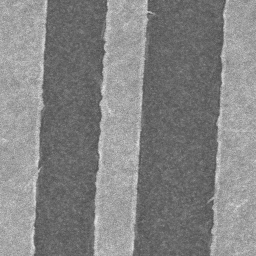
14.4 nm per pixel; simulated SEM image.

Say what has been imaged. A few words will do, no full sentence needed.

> one or a few lines or trenches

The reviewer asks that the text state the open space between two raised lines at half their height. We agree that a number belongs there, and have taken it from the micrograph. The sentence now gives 68.2 px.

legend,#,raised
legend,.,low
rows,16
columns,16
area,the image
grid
###....##.....##
###....##.....##
###....##.....##
###....##.....##
###...###.....##
###...###.....##
###...###.....##
###...###.....##
##....###.....##
##....###.....##
##....###.....##
##....###....###
##....###....###
##....##.....###
##....##.....###
##....##.....###